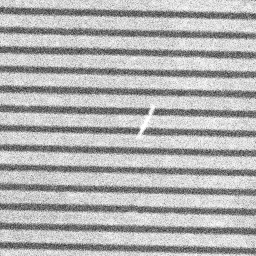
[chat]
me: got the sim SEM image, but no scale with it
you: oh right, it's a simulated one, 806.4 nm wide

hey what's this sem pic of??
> parallel lines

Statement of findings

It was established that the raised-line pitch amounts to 61.7 nm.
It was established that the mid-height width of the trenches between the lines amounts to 0.0236 um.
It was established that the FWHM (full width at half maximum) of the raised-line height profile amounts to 38.2 nanometres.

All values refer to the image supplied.